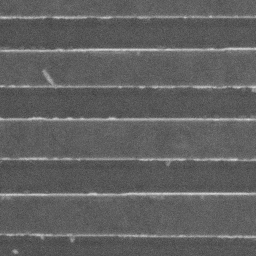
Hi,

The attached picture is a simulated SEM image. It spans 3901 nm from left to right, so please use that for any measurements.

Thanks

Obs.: lines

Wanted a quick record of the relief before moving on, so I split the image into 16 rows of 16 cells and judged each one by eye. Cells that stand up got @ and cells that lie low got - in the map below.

@@@@@@@@@@@@@@@@
----------------
----------------
@@@@@@@@@@@@@@@@
@@@@@@@@@@@@@@@@
----------------
----------------
@@@@@@@@@@@@@@@@
@@@@@@@@@@@@@@@@
@@@@@@@@@@@@@@@@
----------------
----------------
@@@@@@@@@@@@@@@@
@@@@@@@@@@@@@@@@
@@@@@@@@@@@@@@@@
----------------